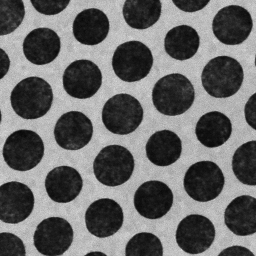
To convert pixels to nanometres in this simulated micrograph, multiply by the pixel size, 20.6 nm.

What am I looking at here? a regular array of holes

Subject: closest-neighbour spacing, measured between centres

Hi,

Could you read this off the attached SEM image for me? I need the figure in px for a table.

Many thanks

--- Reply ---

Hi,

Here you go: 52.5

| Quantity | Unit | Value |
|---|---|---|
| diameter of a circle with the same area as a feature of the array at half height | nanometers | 818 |